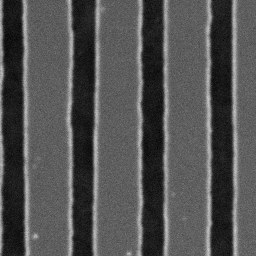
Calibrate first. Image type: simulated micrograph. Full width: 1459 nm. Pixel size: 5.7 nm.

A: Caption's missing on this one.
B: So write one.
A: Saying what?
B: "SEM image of lines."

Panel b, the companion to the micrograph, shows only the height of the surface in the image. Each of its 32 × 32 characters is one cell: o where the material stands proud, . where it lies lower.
...oooooo...oooooo...ooooo...ooo
...oooooo...oooooo...ooooo...ooo
...oooooo...oooooo...ooooo...ooo
...oooooo...oooooo...ooooo...ooo
...oooooo...oooooo...ooooo...ooo
...oooooo...oooooo...ooooo...ooo
...oooooo...oooooo...ooooo...ooo
...oooooo...oooooo...ooooo...ooo
...oooooo...oooooo...ooooo...ooo
...oooooo...oooooo...ooooo...ooo
...oooooo...oooooo...ooooo...ooo
...oooooo...oooooo...ooooo...ooo
...oooooo...oooooo...ooooo...ooo
...oooooo...oooooo...ooooo...ooo
...oooooo...oooooo...ooooo...ooo
...oooooo...oooooo...ooooo...ooo
...oooooo...oooooo...ooooo...ooo
...oooooo...oooooo...ooooo...ooo
...oooooo...oooooo...ooooo...ooo
...oooooo...oooooo...ooooo...ooo
...oooooo...oooooo...ooooo...ooo
...oooooo...oooooo...ooooo...ooo
...oooooo...oooooo...ooooo...ooo
...oooooo...oooooo...ooooo...ooo
...oooooo...oooooo...ooooo...ooo
...oooooo...oooooo...ooooo...ooo
...oooooo...oooooo...ooooo...ooo
...oooooo...oooooo...ooooo...ooo
...oooooo...oooooo...ooooo...ooo
...oooooo...oooooo...ooooo...ooo
...oooooo...oooooo...ooooo...ooo
...oooooo...oooooo...ooooo...ooo